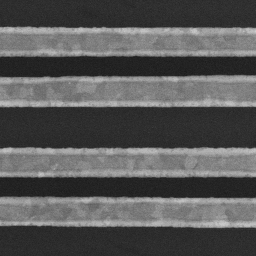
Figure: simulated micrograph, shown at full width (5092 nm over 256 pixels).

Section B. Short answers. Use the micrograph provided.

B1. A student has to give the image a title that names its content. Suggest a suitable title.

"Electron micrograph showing lines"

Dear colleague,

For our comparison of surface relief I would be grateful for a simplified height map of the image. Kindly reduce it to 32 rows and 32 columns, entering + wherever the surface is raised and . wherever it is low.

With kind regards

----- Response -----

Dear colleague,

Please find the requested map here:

................................
................................
................................
................................
++++++++++++++++++++++++++++++++
++++++++++++++++++++++++++++++++
++++++++++++++++++++++++++++++++
................................
................................
................................
++++++++++++++++++++++++++++++++
++++++++++++++++++++++++++++++++
++++++++++++++++++++++++++++++++
................................
................................
................................
................................
................................
................................
++++++++++++++++++++++++++++++++
++++++++++++++++++++++++++++++++
++++++++++++++++++++++++++++++++
................................
................................
................................
++++++++++++++++++++++++++++++++
++++++++++++++++++++++++++++++++
++++++++++++++++++++++++++++++++
................................
................................
................................
................................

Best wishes